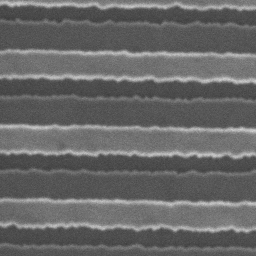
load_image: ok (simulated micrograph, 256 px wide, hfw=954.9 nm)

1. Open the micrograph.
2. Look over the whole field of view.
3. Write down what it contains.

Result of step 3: lines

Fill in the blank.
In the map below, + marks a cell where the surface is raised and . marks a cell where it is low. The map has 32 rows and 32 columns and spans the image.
++++++++++++++++++++++++++++++++
................................
................................
................................
................................
................................
++++++++++..++++....+...........
++++++++++++++++++++++++++++++++
++++++++++++++++++++++++++++++++
++++++++++++++++++++++++++++++++
................................
................................
................................
................................
................................
................................
++++++++++++++++++++++++++++++++
++++++++++++++++++++++++++++++++
++++++++++++++++++++++++++++++++
..................+....+.+++.++.
................................
................................
................................
................................
................................
++++++++++++++++++++++++++++++++
++++++++++++++++++++++++++++++++
++++++++++++++++++++++++++++++++
............++.+++++.+++++++++++
................................
................................
................................